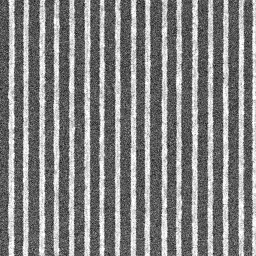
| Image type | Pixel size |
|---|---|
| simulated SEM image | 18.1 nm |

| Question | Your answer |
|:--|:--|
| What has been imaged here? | parallel lines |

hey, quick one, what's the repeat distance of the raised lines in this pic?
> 278 nanometers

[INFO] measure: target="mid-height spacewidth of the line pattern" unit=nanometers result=199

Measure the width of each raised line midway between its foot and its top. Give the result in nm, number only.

77